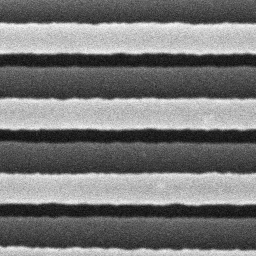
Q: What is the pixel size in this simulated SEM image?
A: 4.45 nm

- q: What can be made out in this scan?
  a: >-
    lines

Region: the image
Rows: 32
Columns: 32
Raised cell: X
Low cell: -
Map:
--------------------------------
--------------------------------
--------------------------------
XXXXXXXXXXXXXXXXXXXXXXXXXXXXXXXX
XXXXXXXXXXXXXXXXXXXXXXXXXXXXXXXX
XXXXXXXXXXXXXXXXXXXXXXXXXXXXXXXX
XXXXXXXXXXXXXXXXXXXXXXXXXXXXXXXX
--------------------------------
--------------------------------
--------------------------------
--------------------------------
--------------------------------
XXXXXXXXXXXXXXXXXXXXXXXXXXXXXXXX
XXXXXXXXXXXXXXXXXXXXXXXXXXXXXXXX
XXXXXXXXXXXXXXXXXXXXXXXXXXXXXXXX
XXXXXXXXXXXXXXXXXXXXXXXXXXXXXXXX
--------------------------------
--------------------------------
--------------------------------
--------------------------------
--------------------------------
--------------------------------
XXXXXXXXXXXXXXXXXXXXXXXXXXXXXXXX
XXXXXXXXXXXXXXXXXXXXXXXXXXXXXXXX
XXXXXXXXXXXXXXXXXXXXXXXXXXXXXXXX
--------------X----XX--XX----XX-
--------------------------------
--------------------------------
--------------------------------
--------------------------------
--------------------------------
XXXXXXXXXXXXXXXXXXXXXXXXXXXXXXXX